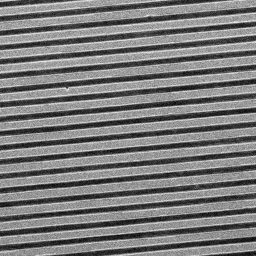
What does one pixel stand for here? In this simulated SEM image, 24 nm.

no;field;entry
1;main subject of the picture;parallel lines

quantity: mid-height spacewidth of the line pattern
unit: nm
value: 135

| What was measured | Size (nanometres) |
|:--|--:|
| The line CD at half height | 200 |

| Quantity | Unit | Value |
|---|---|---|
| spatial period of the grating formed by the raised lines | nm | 343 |